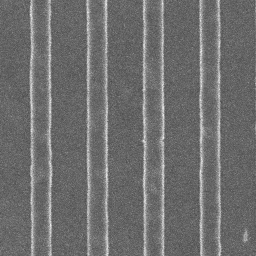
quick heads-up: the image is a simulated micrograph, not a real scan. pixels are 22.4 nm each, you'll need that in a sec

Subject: parallel lines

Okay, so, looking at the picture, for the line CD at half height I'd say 421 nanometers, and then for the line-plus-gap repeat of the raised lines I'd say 1270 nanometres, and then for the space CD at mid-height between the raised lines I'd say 839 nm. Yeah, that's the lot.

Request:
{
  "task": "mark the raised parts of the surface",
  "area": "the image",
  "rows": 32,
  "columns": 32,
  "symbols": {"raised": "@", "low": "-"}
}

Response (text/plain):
----@@-----@@-----@@-----@@-----
----@@-----@@-----@@-----@@-----
----@@-----@@-----@@-----@@-----
----@@-----@@-----@@-----@@-----
----@@-----@@-----@@-----@@-----
----@@-----@@-----@@-----@@-----
----@@-----@@-----@@-----@@-----
----@@-----@@-----@@-----@@-----
----@@-----@@-----@@-----@@-----
----@@-----@@-----@@-----@@-----
----@@-----@@-----@@-----@@-----
----@@-----@@-----@@-----@@-----
----@@-----@@-----@@-----@@-----
----@@-----@@-----@@-----@@-----
----@@-----@@-----@@-----@@-----
----@@-----@@-----@@-----@@-----
----@@-----@@-----@@-----@@-----
----@@-----@@-----@@-----@@-----
----@@-----@@-----@@-----@@-----
----@@-----@@-----@@-----@@-----
----@@-----@@-----@@-----@@-----
----@@-----@@-----@@-----@@-----
----@@-----@@-----@@-----@@-----
----@@-----@@-----@@-----@@-----
----@@-----@@-----@@-----@@-----
----@@-----@@-----@@-----@@-----
----@@-----@@-----@@-----@@-----
----@@-----@@-----@@-----@@-----
----@@-----@@-----@@-----@@-----
----@@-----@@-----@@-----@@-----
----@@-----@@-----@@-----@@-----
----@@-----@@-----@@-----@@@----